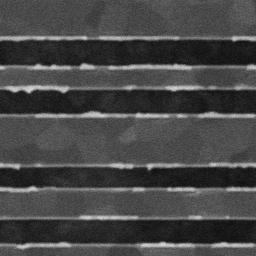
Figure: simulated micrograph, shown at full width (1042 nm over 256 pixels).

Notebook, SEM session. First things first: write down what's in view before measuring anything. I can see one or a few lines or trenches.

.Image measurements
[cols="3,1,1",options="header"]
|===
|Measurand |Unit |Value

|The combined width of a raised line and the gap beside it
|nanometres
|256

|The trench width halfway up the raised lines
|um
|0.0997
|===